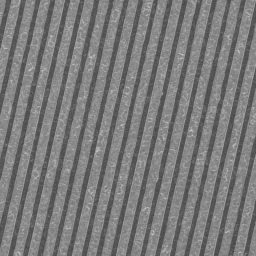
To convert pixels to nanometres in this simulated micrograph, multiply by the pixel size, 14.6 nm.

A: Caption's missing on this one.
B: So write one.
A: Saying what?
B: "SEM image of parallel lines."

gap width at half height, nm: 76.3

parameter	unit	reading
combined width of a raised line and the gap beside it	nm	208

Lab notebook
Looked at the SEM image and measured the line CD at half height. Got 130 nm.